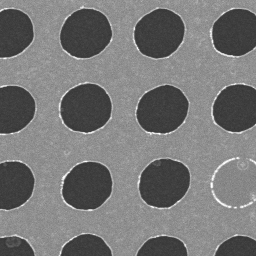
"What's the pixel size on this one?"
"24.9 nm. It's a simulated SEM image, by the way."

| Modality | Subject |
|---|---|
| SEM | holes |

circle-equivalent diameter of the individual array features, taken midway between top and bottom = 1250 nanometres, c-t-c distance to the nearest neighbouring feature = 73.4 px